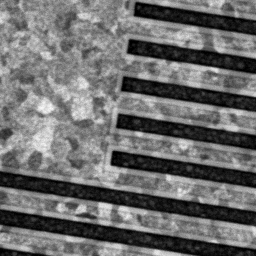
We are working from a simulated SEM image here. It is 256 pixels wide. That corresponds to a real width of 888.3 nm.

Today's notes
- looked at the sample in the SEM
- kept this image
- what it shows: parallel lines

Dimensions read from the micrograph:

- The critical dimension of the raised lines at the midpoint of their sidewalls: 17.3 pixels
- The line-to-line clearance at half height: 69.9 nm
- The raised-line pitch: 0.131 micrometres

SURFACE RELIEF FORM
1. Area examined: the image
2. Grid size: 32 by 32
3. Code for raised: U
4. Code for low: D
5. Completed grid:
UUUUUUUUUUUUUUUUDDDDDUUUUUUUUUUU
UUUUUUUUUUUUUUUUDDDDDDDDDDDUUUUU
UUUUUUUUUUUUUUUUUDDDDDDDDDDDDDDD
UUUUUUUUUUUUUUUUUUUUUUUUDDDDDDDD
UUUUUUUUUUUUUUUUUUUUUUUUUUUUUUDD
UUUUUUUUUUUUUUUUDDDDDDDUUUUUUUUU
UUUUUUUUUUUUUUUUDDDDDDDDDDDDDUUU
UUUUUUUUUUUUUUUUUUDDDDDDDDDDDDDD
UUUUUUUUUUUUUUUUUUUUUUUUUDDDDDDD
UUUUUUUUUUUUUUUDDUUUUUUUUUUUUUUD
UUUUUUUUUUUUUUUDDDDDDDDDUUUUUUUU
UUUUUUUUUUUUUUUDDDDDDDDDDDDDDDUU
UUUUUUUUUUUUUUUUUUUUDDDDDDDDDDDD
UUUUUUUUUUUUUUUUUUUUUUUUUUUDDDDD
UUUUUUUUUUUUUUDDDDDUUUUUUUUUUUUU
UUUUUUUUUUUUUUDDDDDDDDDDDUUUUUUU
UUUUUUUUUUUUUUUDDDDDDDDDDDDDDDDD
UUUUUUUUUUUUUUUUUUUUUUDDDDDDDDDD
UUUUUUUUUUUUUUUUUUUUUUUUUUUUDDDD
UUUUUUUUUUUUUUDDDDDDDUUUUUUUUUUU
UUUUUUUUUUUUUDDDDDDDDDDDDDDUUUUU
DDDUUUUUUUUUUUUUUDDDDDDDDDDDDDDD
DDDDDDDDDUUUUUUUUUUUUUUDDDDDDDDD
DDDDDDDDDDDDDDDUUUUUUUUUUUUUUDDD
UUUUUUDDDDDDDDDDDDDDDDUUUUUUUUUU
UUUUUUUUUUUUDDDDDDDDDDDDDDDDUUUU
DDDDUUUUUUUUUUUUUUDDDDDDDDDDDDDD
DDDDDDDDDDDUUUUUUUUUUUUUUDDDDDDD
DDDDDDDDDDDDDDDDDUUUUUUUUUUUUUUD
UUUUUUUDDDDDDDDDDDDDDDDDUUUUUUUU
UUUUUUUUUUUUUDDDDDDDDDDDDDDDDDUU
DDDDDUUUUUUUUUUUUUUDDDDDDDDDDDDD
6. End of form